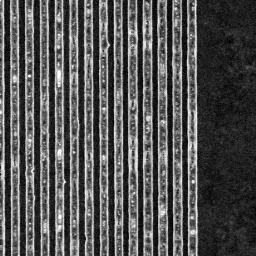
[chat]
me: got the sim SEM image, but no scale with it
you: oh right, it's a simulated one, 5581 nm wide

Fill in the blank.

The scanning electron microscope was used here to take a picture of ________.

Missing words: parallel lines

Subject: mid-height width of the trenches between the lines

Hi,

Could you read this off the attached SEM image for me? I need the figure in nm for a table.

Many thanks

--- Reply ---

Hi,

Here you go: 150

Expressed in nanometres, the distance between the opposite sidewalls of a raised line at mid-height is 174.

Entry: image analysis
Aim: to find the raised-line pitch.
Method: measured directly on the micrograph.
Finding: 322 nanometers